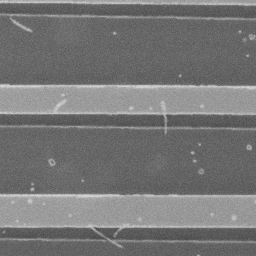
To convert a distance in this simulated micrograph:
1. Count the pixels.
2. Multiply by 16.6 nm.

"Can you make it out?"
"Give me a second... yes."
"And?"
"lines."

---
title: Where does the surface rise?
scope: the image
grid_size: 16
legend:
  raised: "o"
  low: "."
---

................
................
................
................
................
oooooooooooooooo
oooooooooooooooo
................
................
................
................
................
oooooooooooooooo
oooooooooooooooo
................
................